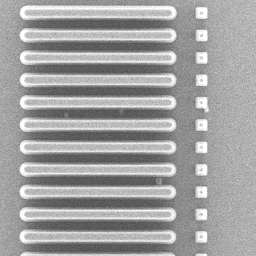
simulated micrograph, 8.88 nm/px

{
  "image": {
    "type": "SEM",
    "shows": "groups of lines, slits or small figures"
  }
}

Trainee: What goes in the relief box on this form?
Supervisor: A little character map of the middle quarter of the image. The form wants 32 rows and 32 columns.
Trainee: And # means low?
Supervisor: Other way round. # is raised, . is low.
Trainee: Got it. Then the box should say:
................................
................................
................................
###########################.....
###########################.....
...................#######......
................................
................................
###########################.....
###########################.....
###########################.....
................................
................................
................................
###########################.....
###########################.....
................................
................................
................................
###########################.....
###########################.....
###########################.....
................................
................................
................................
###########################.....
###########################.....
###########################.....
................................
................................
................................
###########################.....